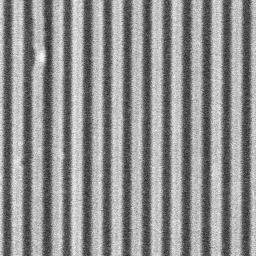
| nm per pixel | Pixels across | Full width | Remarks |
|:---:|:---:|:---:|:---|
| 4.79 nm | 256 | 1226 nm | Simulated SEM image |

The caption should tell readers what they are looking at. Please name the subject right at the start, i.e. parallel lines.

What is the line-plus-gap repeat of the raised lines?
95.3 nm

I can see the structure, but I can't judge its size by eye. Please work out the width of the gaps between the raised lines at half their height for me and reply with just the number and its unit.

54.5 nm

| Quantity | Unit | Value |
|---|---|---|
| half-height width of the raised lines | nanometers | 42.5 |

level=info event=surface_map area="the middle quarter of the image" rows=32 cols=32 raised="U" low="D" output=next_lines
DDUUDDDUUDDDUUDDDUUDDDUUDDDUUDDD
DDUUDDDUUDDDUUDDDUUDDDUUDDDUUDDD
DDUUDDDUUDDDUUDDDUUDDDUUDDDUUDDD
DDUUDDDUUDDDUUDDDUUDDDUUDDDUUDDD
DDUUDDDUUDDDUUDDDUUDDDUUDDDUUDDD
DDUUDDDUUDDDUUDDDUUDDDUUDDDUUDDD
DDUUDDDUUDDDUUDDDUUDDDUUDDDUUDDD
DDUUDDDUUDDDUUDDDUUDDDUUDDDUUDDD
DDUUDDDUUDDDUUDDDUUDDDUUDDDUUDDD
DDUUDDDUUDDDUUDDDUUDDDUUDDDUUDDD
DDUUDDDUUDDDUUDDDUUDDDUUDDDUUDDD
DDUUDDDUUDDDUUDDDUUDDDUUDDDUUDDD
DDUUDDDUUDDDUUDDDUUDDDUUDDDUUDDD
DDUUDDDUUDDDUUDDDUUDDDUUDDDUUDDD
DDUUDDDUUDDDUUDDDUUDDDUUDDDUUDDD
DDUUDDDUUDDDUUDDDUUDDDUUDDDUUDDD
DDUUDDDUUDDDUUDDDUUDDDUUDDDUUDDD
DDUUDDDUUDDDUUDDDUUDDDUUDDDUUDDD
DDUUDDDUUDDDUUDDDUUDDDUUDDDUUDDD
DDUUDDDUUDDDUUDDDUUDDDUUDDDUUDDD
DDUUDDDUUDDDUUDDDUUDDDUUDDDUUDDD
DDUUDDDUUDDDUUDDDUUDDDUUDDDUUDDD
DDUUDDDUUDDDUUDDDUUDDDUUDDDUUDDD
DDUUDDDUUDDDUUDDDUUDDDUUDDDUUDDD
DDUUDDDUUDDDUUDDDUUDDDUUDDDUUDDD
DDUUDDDUUDDDUUDDDUUDDDUUDDDUUDDD
DDUUDDDUUDDDUUDDDUUDDDUUDDDUUDDD
DDUUDDDUUDDDUUDDDUUDDDUUDDDUUDDD
DDUUDDDUUDDDUUDDDUUDDDUUDDDUUDDD
DDUUDDDUUDDDUUDDDUUDDDUUDDDUUDDD
DDUUDDDUUDDDUUDDDUUDDDUUDDDUUDDD
DDUUDDDUUDDDUUDDDUUDDDUUDDDUUDDD